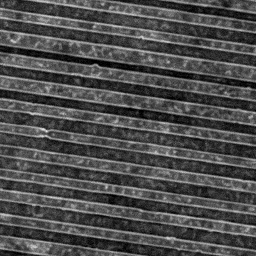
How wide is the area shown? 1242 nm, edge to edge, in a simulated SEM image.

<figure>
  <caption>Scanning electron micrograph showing parallel lines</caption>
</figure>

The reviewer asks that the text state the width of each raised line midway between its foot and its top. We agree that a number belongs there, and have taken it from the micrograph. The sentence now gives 0.051 micrometres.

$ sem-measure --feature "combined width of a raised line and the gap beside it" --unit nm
109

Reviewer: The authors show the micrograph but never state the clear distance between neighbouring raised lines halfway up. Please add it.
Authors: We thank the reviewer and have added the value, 0.0601 microns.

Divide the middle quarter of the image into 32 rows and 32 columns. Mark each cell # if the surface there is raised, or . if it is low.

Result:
#########............###########
##############..............####
.###################............
........###################.....
...............#################
#.....................##########
##########...................###
###############.................
.#####################.#........
........#####################...
...............#################
###...................##########
###########..................###
################................
........###############.........
.............#################..
....................############
####........................####
###########.....................
..################..............
.........################.......
................################
.......................#########
#######.......................##
##############..................
..#################.#...........
.........##################.....
................################
.......................#########
#######.......................##
##############..................
.....################...........